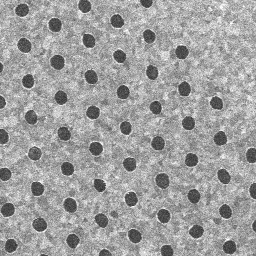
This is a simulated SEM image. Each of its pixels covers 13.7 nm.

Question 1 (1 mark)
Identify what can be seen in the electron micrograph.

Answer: a regular array of holes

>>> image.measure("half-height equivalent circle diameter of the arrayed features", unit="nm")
197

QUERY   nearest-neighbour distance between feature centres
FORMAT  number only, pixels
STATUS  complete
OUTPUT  35.2